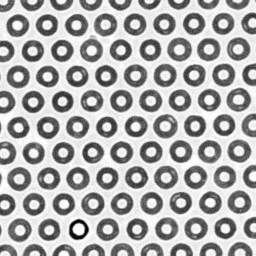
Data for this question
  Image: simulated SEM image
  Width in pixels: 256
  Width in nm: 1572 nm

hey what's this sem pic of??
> a regular array of ring-shaped grooves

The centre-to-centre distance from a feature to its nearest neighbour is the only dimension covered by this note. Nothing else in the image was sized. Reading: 179 nm